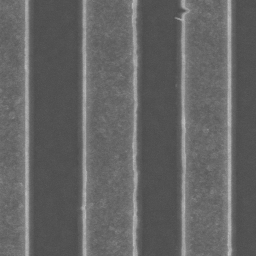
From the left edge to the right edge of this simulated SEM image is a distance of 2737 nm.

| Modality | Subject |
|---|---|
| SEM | one or a few lines or trenches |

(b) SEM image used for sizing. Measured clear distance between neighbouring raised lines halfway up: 565 nm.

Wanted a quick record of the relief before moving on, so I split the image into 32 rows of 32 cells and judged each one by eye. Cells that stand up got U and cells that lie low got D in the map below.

UUUDDDDDDDDUUUUUUDDDDDDUUUUUUDDD
UUUDDDDDDDDUUUUUUDDDDDDUUUUUUDDD
UUUDDDDDDDUUUUUUUDDDDDDUUUUUUDDD
UUUDDDDDDDDUUUUUUDDDDDDUUUUUUDDD
UUUDDDDDDDUUUUUUUDDDDDDUUUUUUDDD
UUUDDDDDDDUUUUUUUDDDDDDUUUUUUDDD
UUUDDDDDDDDUUUUUUDDDDDDUUUUUUDDD
UUUDDDDDDDDUUUUUUDDDDDDUUUUUUDDD
UUUDDDDDDDDUUUUUUDDDDDDUUUUUUDDD
UUUDDDDDDDDUUUUUUDDDDDDUUUUUUDDD
UUUDDDDDDDDUUUUUUDDDDDDUUUUUUDDD
UUUDDDDDDDDUUUUUUDDDDDDUUUUUUDDD
UUUDDDDDDDDUUUUUUDDDDDDUUUUUUDDD
UUUDDDDDDDDUUUUUUDDDDDDUUUUUUDDD
UUUDDDDDDDDUUUUUUDDDDDDUUUUUUDDD
UUUDDDDDDDUUUUUUUDDDDDDUUUUUUDDD
UUUDDDDDDDUUUUUUUDDDDDDUUUUUUDDD
UUUDDDDDDDDUUUUUUDDDDDDUUUUUUDDD
UUUDDDDDDDDUUUUUUDDDDDDUUUUUUDDD
UUUDDDDDDDUUUUUUUDDDDDDUUUUUUDDD
UUUDDDDDDDUUUUUUUDDDDDDUUUUUUDDD
UUUDDDDDDDDUUUUUUDDDDDDUUUUUUDDD
UUUDDDDDDDDUUUUUUDDDDDDUUUUUUDDD
UUUDDDDDDDDUUUUUUDDDDDDUUUUUUDDD
UUUDDDDDDDUUUUUUUDDDDDDUUUUUUDDD
UUUDDDDDDDUUUUUUUDDDDDDUUUUUUDDD
UUUDDDDDDDUUUUUUUDDDDDDUUUUUUDDD
UUUDDDDDDDDUUUUUUDDDDDDUUUUUUDDD
UUUDDDDDDDDUUUUUUDDDDDDUUUUUUDDD
UUUDDDDDDDDUUUUUUDDDDDDUUUUUUDDD
UUUDDDDDDDDUUUUUUDDDDDDUUUUUUDDD
UUUDDDDDDDDUUUUUUDDDDDDUUUUUUDDD